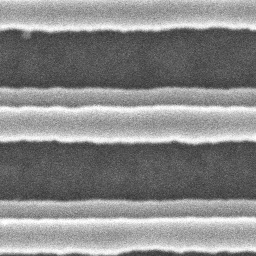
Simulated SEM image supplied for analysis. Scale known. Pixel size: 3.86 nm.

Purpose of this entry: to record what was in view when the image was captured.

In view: lines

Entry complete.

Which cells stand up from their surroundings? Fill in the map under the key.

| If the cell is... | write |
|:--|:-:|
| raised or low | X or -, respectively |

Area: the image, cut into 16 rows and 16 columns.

XXXXXXXXXXXXXXXX
XXXXXXXXXXXXXXXX
----------------
----------------
----------------
----------------
XXXXXXXXXXXXXXXX
XXXXXXXXXXXXXXXX
XXXXXXXXXXXXXXXX
----------------
----------------
----------------
----------------
XXXXXXXXXXXXXXXX
XXXXXXXXXXXXXXXX
XXXXXXXXXXXXXXXX